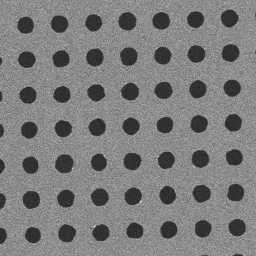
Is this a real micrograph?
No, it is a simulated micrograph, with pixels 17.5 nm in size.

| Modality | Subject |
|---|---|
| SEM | a regular array of holes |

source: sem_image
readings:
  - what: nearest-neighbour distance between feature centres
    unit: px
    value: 33.9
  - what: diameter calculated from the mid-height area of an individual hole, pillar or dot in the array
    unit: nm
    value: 304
